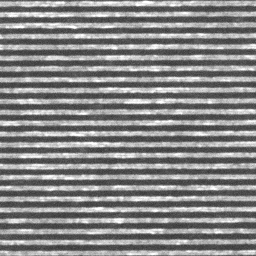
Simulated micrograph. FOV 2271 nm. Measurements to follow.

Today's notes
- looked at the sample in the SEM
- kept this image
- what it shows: parallel lines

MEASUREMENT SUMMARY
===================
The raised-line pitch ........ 96.1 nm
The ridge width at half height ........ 33.3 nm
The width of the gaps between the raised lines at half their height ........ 61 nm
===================